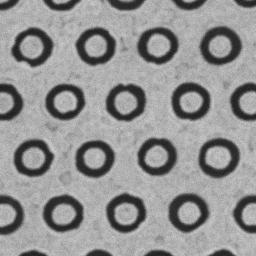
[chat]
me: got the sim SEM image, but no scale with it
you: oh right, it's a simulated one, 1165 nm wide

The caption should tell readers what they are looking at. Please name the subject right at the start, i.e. a regular array of ring-shaped grooves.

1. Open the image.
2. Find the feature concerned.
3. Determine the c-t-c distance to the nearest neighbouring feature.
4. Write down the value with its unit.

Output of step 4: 281 nanometres